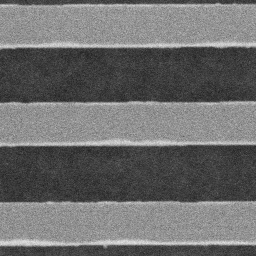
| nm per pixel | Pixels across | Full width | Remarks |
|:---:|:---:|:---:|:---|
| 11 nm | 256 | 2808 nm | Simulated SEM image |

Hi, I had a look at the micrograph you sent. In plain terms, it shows lines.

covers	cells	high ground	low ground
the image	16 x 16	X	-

XXXXXXXXXXXXXXXX
XXXXXXXXXXXXXXXX
XXXXXXXXXXXXXXXX
----------------
----------------
----------------
XXXXXXXXXXXXXXXX
XXXXXXXXXXXXXXXX
XXXXXXXXXXXXXXXX
----------------
----------------
----------------
----------------
XXXXXXXXXXXXXXXX
XXXXXXXXXXXXXXXX
----------------